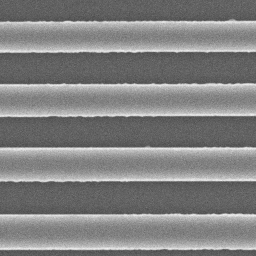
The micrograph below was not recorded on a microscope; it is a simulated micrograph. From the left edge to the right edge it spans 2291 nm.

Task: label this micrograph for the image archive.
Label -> lines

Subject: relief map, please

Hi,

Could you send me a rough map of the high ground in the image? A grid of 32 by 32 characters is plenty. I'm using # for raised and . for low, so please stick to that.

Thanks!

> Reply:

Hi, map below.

................................
................................
................................
################################
################################
################################
##########..##.##.....#.........
................................
................................
................................
.......##......#...#...##.######
################################
################################
################################
######.######.##................
................................
................................
................................
..............................#.
################################
################################
################################
################################
................................
................................
................................
................................
################################
################################
################################
################################
................................